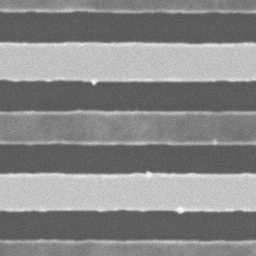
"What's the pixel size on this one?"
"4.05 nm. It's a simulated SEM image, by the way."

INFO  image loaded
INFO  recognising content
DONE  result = lines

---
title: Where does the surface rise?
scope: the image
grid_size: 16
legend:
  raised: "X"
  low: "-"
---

XXXXXXXXXXXXXXXX
----------------
----------------
XXXXXXXXXXXXXXXX
XXXXXXXXXXXXXXXX
----------------
----------------
XXXXXXXXXXXXXXXX
XXXXXXXXXXXXXXXX
----------------
----------------
XXXXXXXXXXXXXXXX
XXXXXXXXXXXXXXXX
----------------
----------------
XXXXXXXXXXXXXXXX